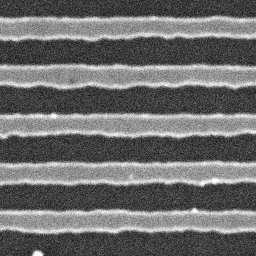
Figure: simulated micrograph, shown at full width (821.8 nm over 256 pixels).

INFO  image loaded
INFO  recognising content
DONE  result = lines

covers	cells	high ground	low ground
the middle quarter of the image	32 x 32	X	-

XXXXXX------XXX-----------------
XXXXXXXXXXXXXXXXXXXXXXXXXXXXXXXX
XXXXXXXXXXXXXXXXXXXXXXXXXXXXXXXX
XXXXXXXXXXXXXXXXXXXXXXXXXXXXXXXX
XXXXXXXXXXXXXXXXXXXXXXXXXXXXXXXX
XXXXX----XXXXXXXX-----X---XXX---
--------------------------------
--------------------------------
--------------------------------
--------------------------------
--------------------------------
--------------------------------
--------------------------------
XXXXXXXXXXXXXXXXXXXXXXXXXXXXXXXX
XXXXXXXXXXXXXXXXXXXXXXXXXXXXXXXX
XXXXXXXXXXXXXXXXXXXXXXXXXXXXXXXX
XXXXXXXXXXXXXXXXXXXXXXXXXXXXXXXX
----------XXXXXXXXXXXXXXXXXXXXXX
--------------------------------
--------------------------------
--------------------------------
--------------------------------
--------------------------------
--------------------------------
--------------------------------
XXXXXXXXXXXXXXXXXXXXXXXXXXXXXXXX
XXXXXXXXXXXXXXXXXXXXXXXXXXXXXXXX
XXXXXXXXXXXXXXXXXXXXXXXXXXXXXXXX
XXXXXXXXXXXXXXXXXXXXXXXXXXXXXXXX
XXXXXXXXXXXXXXXXXXXXXX---XXX--XX
--------------------------------
--------------------------------